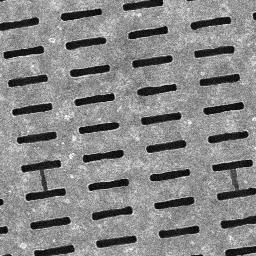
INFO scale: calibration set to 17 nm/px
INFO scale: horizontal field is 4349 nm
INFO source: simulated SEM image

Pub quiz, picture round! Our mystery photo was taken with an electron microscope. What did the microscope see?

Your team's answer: a regular array of holes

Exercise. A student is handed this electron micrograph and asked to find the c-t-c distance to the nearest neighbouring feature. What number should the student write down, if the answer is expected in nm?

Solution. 486